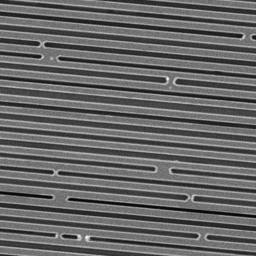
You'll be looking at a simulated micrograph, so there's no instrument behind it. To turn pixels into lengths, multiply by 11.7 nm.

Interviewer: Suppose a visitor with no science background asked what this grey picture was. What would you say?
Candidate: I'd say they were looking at parallel lines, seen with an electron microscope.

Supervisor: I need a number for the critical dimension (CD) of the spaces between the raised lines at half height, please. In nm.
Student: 61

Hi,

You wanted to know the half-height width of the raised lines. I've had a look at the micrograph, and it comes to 81.3 nm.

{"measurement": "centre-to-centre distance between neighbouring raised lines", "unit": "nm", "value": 148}